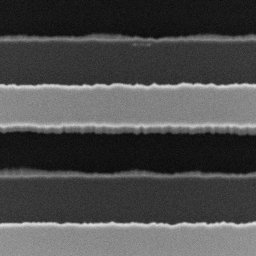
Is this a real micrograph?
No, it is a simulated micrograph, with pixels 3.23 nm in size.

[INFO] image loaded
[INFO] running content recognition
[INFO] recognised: lines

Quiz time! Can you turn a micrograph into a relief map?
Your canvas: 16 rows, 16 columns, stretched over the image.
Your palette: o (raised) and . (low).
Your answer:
................
................
oooooooooooooooo
oooooooooooooooo
oooooooooooooooo
oooooooooooooooo
oooooooooooooooo
oooooooooooooooo
................
................
................
oooooooooooooooo
oooooooooooooooo
oooooooooooooooo
oooooooooooooooo
oooooooooooooooo